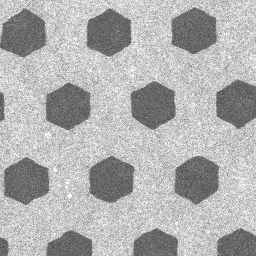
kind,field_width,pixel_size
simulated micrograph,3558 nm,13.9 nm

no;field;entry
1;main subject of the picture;holes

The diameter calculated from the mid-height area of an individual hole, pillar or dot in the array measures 0.635 micrometres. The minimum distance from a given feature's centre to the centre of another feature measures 1170 nanometers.